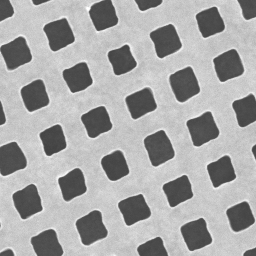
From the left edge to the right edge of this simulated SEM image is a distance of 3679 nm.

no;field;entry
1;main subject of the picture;a regular array of holes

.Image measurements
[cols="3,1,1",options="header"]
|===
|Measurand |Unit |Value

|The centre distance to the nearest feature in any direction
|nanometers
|676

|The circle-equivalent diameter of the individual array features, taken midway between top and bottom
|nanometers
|414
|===